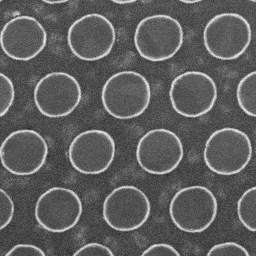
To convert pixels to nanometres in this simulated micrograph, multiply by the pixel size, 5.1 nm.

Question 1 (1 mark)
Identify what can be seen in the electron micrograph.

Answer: a regular array of raised bodies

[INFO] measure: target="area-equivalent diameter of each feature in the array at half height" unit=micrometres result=0.228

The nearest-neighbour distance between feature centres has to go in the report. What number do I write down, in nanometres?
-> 338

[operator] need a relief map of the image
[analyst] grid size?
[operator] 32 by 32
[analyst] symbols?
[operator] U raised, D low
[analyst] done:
DDDDDDDDDDDDDDDDDDDDDDDDDDDDDDDD
DDDDDDDDDDDDDDDDDDDDDDDDDDDDDDDD
DDUUDDDDDDUUUDDDDDUUUUDDDDDUUUDD
DUUUUDDDDUUUUUDDDUUUUUUDDDUUUUUD
UUUUUUDDDUUUUUDDDUUUUUUDDDUUUUUD
UUUUUUDDDUUUUUDDDUUUUUUDDDUUUUUD
DUUUUDDDDUUUUDDDDUUUUUDDDDUUUUDD
DDDDDDDDDDDDDDDDDDDDDDDDDDDDDDDD
DDDDDDDDDDDDDDDDDDDDDDDDDDDDDDDD
DDDDDDUUUDDDDDUUUUDDDDDUUUDDDDDU
UDDDDUUUUUDDDUUUUUDDDDUUUUUDDDUU
UUDDUUUUUUDDDUUUUUUDDUUUUUUDDDUU
UUDDUUUUUUDDDUUUUUUDDDUUUUUDDDUU
UDDDDUUUUDDDDUUUUUDDDDUUUUDDDDUU
DDDDDDUDDDDDDDUUUDDDDDDDDDDDDDDD
DDDDDDDDDDDDDDDDDDDDDDDDDDDDDDDD
DDUUDDDDDDDUUDDDDDDUUDDDDDDUUUDD
DUUUUDDDDUUUUUDDDDUUUUDDDDUUUUUD
UUUUUUDDDUUUUUDDDUUUUUUDDDUUUUUD
UUUUUUDDDUUUUUDDDUUUUUUDDDUUUUUD
UUUUUDDDDUUUUUDDDDUUUUDDDDUUUUUD
DDUUDDDDDDUUDDDDDDDUUDDDDDDUUDDD
DDDDDDDDDDDDDDDDDDDDDDDDDDDDDDDD
DDDDDDDDDDDDDDDUUDDDDDDDUDDDDDDD
UDDDDUUUUDDDDDUUUUDDDDUUUUUDDDUU
UUDDDUUUUUDDDUUUUUUDDUUUUUUDDDUU
UUDDDUUUUUDDDUUUUUUDDUUUUUUDDDUU
UDDDDUUUUUDDDUUUUUDDDDUUUUUDDDUU
DDDDDDUUUDDDDDUUUDDDDDDUUUDDDDDU
DDDDDDDDDDDDDDDDDDDDDDDDDDDDDDDD
DDDDDDDDDDDDDDDDDDDDDDDDDDDDUDDD
DUUUUDDDDDUUUUDDDDUUUUDDDDUUUUUD